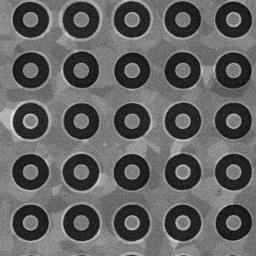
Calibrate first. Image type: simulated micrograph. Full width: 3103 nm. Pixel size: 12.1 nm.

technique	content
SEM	an array of small figures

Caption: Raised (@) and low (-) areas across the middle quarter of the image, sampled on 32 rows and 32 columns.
---@@@---@@@@---@@---@@@@---@@@-
---@@@---@@@---@@@@---@@@---@@@@
---@@@---@@@@--@@@----@@@---@@@-
---------@@@@--------@@@@-------
@-------@@@@@--------@@@@@------
@@-----@@@@@@@------@@@@@@@-----
@@@@@@@@@@@@@@@@@@@@@@@@@@@@@@@@
@@@@@@@@@@@@@@@@@@@@@@@@@@@@@@@@
@@@@@@@@@@@@@@@@@@@@@@@@@@@@@@@@
@@@@@@@@@@@@@@@@@@@@@@@@@@@@@--@
@@-----@@@@@@@@-----@@@@@@@-----
@-------@@@@@--------@@@@@------
---------@@@@---------@@@-------
---@@@---@@@---@@@@---@@@---@@@-
---@@@---@@@---@@@@---@@@---@@@-
---@@@---@@@@---@@----@@@---@@@-
--------@@@@@--------@@@@-------
@-------@@@@@@------@@@@@@------
@@-----@@@@@@@@----@@@@@@@@-----
@@@@@@@@@@@@@@@@@@@@@@@@@@@@@@@@
@@@@@@@@@@@@@@@@@@@@@@@@@@@@@@@@
@@@@@@@@@@@@@@@@@@@@@@@@@@@@@@@@
@@@--@@@@@@@@@@@@@@@@@@@@@@@@--@
@------@@@@@@@------@@@@@@@-----
--------@@@@@--------@@@@@------
---@@----@@@@---@@---@@@@----@--
---@@@---@@@---@@@@---@@@---@@@-
---@@@---@@@---@@@@---@@@---@@@-
---@@----@@@----@@---@@@@----@--
--------@@@@@--------@@@@@------
@-------@@@@@@------@@@@@@@-----
@@@---@@@@@@@@@@--@@@@@@@@@@@--@